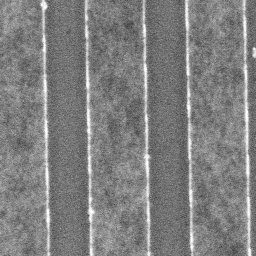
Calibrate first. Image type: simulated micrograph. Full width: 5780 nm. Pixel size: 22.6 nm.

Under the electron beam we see lines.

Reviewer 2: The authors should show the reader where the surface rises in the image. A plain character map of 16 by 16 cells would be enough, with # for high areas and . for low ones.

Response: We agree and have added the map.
###..####...###.
###..####...###.
###..####...###.
###..####...###.
###..####...###.
###..####...###.
###...###...###.
###...###...###.
###...###...###.
###...###...###.
###...###...###.
###...###...###.
###...###...####
###...###...####
###...###...####
###...###...####